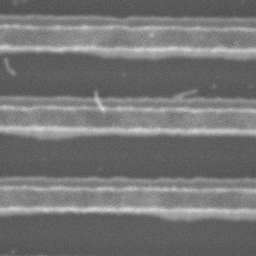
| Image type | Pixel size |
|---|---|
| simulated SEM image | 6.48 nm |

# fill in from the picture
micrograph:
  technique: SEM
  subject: lines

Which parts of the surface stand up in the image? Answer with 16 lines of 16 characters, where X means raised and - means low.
----------------
XXXXXXXXXXXXXXXX
XXXXXXXXXXXXXXXX
----------------
----------------
----------------
XXXXXXXXXXXXXXXX
XXXXXXXXXXXXXXXX
----------------
----------------
----------------
XXXXXXXXXXXXXXXX
XXXXXXXXXXXXXXXX
----------------
----------------
----------------